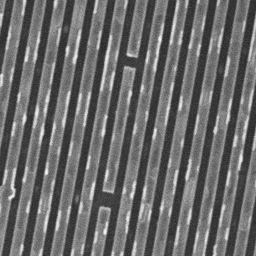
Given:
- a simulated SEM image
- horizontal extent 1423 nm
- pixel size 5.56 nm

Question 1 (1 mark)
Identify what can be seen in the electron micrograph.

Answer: parallel lines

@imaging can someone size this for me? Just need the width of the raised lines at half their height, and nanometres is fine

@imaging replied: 60.2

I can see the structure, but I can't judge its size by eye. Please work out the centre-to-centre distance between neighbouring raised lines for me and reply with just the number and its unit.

0.111 microns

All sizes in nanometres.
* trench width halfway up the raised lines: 50